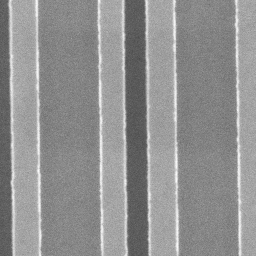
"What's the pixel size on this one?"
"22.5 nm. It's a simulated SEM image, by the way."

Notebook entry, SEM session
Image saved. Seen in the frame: lines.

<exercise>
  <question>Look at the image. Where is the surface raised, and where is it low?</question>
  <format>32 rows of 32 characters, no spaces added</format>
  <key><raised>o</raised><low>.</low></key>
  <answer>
.oooo.......ooo...oooo........oo
.oooo.......ooo...oooo........oo
.oooo.......ooo...oooo........oo
.oooo.......ooo...oooo........oo
.oooo.......ooo...oooo........oo
.oooo.......ooo...oooo........oo
.oooo.......ooo...oooo........oo
.oooo.......ooo...oooo........oo
.oooo.......ooo...oooo........oo
.oooo.......ooo....ooo........oo
.oooo.......ooo....ooo........oo
.oooo.......ooo....ooo........oo
..ooo........oo....ooo........oo
..ooo........ooo...ooo........oo
..ooo........ooo...ooo........oo
..ooo........ooo...ooo........oo
..ooo........ooo...ooo........oo
..ooo........ooo...ooo........oo
..ooo........ooo...ooo........oo
..ooo........ooo...ooo........oo
..ooo........ooo...ooo........oo
..ooo........ooo...ooo........oo
..ooo........ooo...ooo........oo
..ooo........ooo...ooo........oo
..ooo........ooo...ooo........oo
..ooo........ooo...ooo........oo
..ooo........ooo...ooo........oo
..ooo........ooo...ooo........oo
..ooo........ooo...ooo........oo
..ooo........ooo...ooo........oo
..ooo........ooo...ooo........oo
..ooo........ooo...ooo........oo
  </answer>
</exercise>